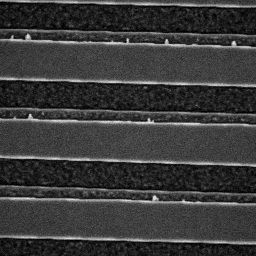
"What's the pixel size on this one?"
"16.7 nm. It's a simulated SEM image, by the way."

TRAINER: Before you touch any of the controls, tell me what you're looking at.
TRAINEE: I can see lines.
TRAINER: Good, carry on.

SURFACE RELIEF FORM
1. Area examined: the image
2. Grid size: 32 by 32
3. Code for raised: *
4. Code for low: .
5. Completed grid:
.................***************
................................
................................
................................
................................
*********************...........
********************************
********************************
********************************
********************************
.....................***********
................................
................................
................................
................................
*************************.......
********************************
********************************
********************************
********************************
........................********
................................
................................
................................
................................
******************************..
********************************
********************************
********************************
********************************
................................
................................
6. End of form